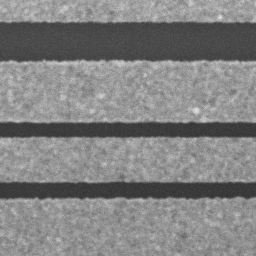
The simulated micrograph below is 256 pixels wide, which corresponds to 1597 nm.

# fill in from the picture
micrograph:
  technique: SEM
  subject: lines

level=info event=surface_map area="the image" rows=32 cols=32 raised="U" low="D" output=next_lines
UUUUUUUUUUUUUUUUUUUUUUUUUUUUUUUU
UUUUUUUUUUUUUUUUUUUUUUUUUUUUUUUU
UUUUUUUUUUUUUUUUUUUUUUUUUUUUUUUU
DDDDDDDDDDDDDDDDDDDDDDDDDDDDDDDD
DDDDDDDDDDDDDDDDDDDDDDDDDDDDDDDD
DDDDDDDDDDDDDDDDDDDDDDDDDDDDDDDD
DDDDDDDDDDDDDDDDDDDDDDDDDDDDDDDD
DDDDDDDDDDDDDDDDDDDDDDDDDDDDDDDD
UUUUUUUUUUUUUUUUUUUUUUUUUUUUUUUU
UUUUUUUUUUUUUUUUUUUUUUUUUUUUUUUU
UUUUUUUUUUUUUUUUUUUUUUUUUUUUUUUU
UUUUUUUUUUUUUUUUUUUUUUUUUUUUUUUU
UUUUUUUUUUUUUUUUUUUUUUUUUUUUUUUU
UUUUUUUUUUUUUUUUUUUUUUUUUUUUUUUU
UUUUUUUUUUUUUUUUUUUUUUUUUUUUUUUU
DDDDDDDDDDDDDDDDDDDDDDDDDDDDDDDD
DDDDDDDDDDDDDDDDDDDDDDDDDDDDDDDD
UUUUUUUUUUUUUUUUUUUUUUUUUUUUUUUU
UUUUUUUUUUUUUUUUUUUUUUUUUUUUUUUU
UUUUUUUUUUUUUUUUUUUUUUUUUUUUUUUU
UUUUUUUUUUUUUUUUUUUUUUUUUUUUUUUU
UUUUUUUUUUUUUUUUUUUUUUUUUUUUUUUU
UUUUUUUUUUUUUUUUUUUUUUUUUUUUUUUU
DDDDDDDDDDDDDDDDDDDDDDDDDDDDDDDD
DDDDDDDDDDDDDDDDDDDDDDDDDDDDDDDD
UUUUUUUUUUUUUUUUUUUUUUUUUUUUUUUU
UUUUUUUUUUUUUUUUUUUUUUUUUUUUUUUU
UUUUUUUUUUUUUUUUUUUUUUUUUUUUUUUU
UUUUUUUUUUUUUUUUUUUUUUUUUUUUUUUU
UUUUUUUUUUUUUUUUUUUUUUUUUUUUUUUU
UUUUUUUUUUUUUUUUUUUUUUUUUUUUUUUU
UUUUUUUUUUUUUUUUUUUUUUUUUUUUUUUU